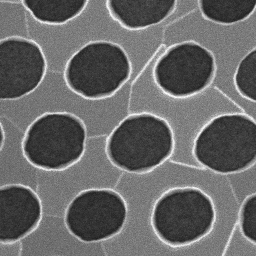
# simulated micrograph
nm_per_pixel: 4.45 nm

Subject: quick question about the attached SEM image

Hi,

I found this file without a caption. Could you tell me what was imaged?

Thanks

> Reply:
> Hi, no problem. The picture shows holes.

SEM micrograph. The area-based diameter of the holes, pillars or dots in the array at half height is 253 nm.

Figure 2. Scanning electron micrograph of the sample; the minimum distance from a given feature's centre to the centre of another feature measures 375 nanometres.